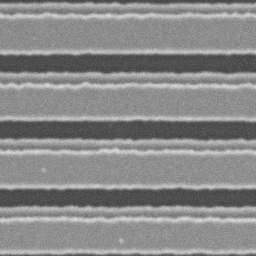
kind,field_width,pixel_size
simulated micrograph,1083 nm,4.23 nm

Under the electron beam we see lines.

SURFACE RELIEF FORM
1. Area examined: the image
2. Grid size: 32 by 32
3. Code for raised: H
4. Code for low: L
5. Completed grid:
LLLLLHHHHLLHLLHLLLLLLLLLLLLLLLLL
HHHHHHHHHHHHHHHHHHHHHHHHHHHHHHHH
HHHHHHHHHHHHHHHHHHHHHHHHHHHHHHHH
HHHHHHHHHHHHHHHHHHHHHHHHHHHHHHHH
HHHHHHHHHHHHHHHHHHHHHHHHHHHHHHHH
HHHHHHHHHHHHHHHHHHHHHHHHHHHHHHHH
HHHHHHHHHHHHHHHHHHHHHHHHHHHHHHHH
LLLLLLLLLLLLLLLLLLLLLLLLLLLLLLLL
LLLLLLLLLLLLLLLLLLLLLLLLLLLLLLLL
HHHHHHHHHHHHHHHHHHHHHHHHHHHHHHHH
HHHHHHHHHHHHHHHHHHHHHHHHHHHHHHHH
HHHHHHHHHHHHHHHHHHHHHHHHHHHHHHHH
HHHHHHHHHHHHHHHHHHHHHHHHHHHHHHHH
HHHHHHHHHHHHHHHHHHHHHHHHHHHHHHHH
HHHHHHHHHHHHHHHHHHHHHHHHHHHHHHHH
LLLLLLLLLLLLLLLLLLLLLLLLLLLLLLLL
LLLLLLLLLLLLLLLLLLLLLLLLLLLLLLLL
HHHHHHHHHHLLLLLLLLLHLLLHLLLLLLLL
HHHHHHHHHHHHHHHHHHHHHHHHHHHHHHHH
HHHHHHHHHHHHHHHHHHHHHHHHHHHHHHHH
HHHHHHHHHHHHHHHHHHHHHHHHHHHHHHHH
HHHHHHHHHHHHHHHHHHHHHHHHHHHHHHHH
HHHHHHHHHHHHHHHHHHHHHHHHHHHHHHHH
LHLLLLLHLLLLLHLHHLLHLLLLHLHLHHLL
LLLLLLLLLLLLLLLLLLLLLLLLLLLLLLLL
LLLLLLLLLLLLLLLLLLLLLLLLLLLLLLLL
HHHHHHHHHHHHHHHHHHHHHHHHHHHHHHHH
HHHHHHHHHHHHHHHHHHHHHHHHHHHHHHHH
HHHHHHHHHHHHHHHHHHHHHHHHHHHHHHHH
HHHHHHHHHHHHHHHHHHHHHHHHHHHHHHHH
HHHHHHHHHHHHHHHHHHHHHHHHHHHHHHHH
HHHHHHHHHHHHHHHHHHHHHHHHHHHHHHHH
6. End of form